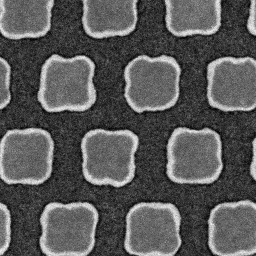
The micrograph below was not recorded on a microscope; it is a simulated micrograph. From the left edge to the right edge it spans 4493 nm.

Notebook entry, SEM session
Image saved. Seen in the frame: raised bodies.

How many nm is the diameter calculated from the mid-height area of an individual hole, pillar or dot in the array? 985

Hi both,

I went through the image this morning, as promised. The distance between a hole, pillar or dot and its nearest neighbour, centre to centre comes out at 1470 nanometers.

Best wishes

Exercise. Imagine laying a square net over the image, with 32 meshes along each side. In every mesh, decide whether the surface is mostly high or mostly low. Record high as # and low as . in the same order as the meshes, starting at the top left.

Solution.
#######....######....######.....
######.....######....######....#
######....#######....######....#
######.....######....######....#
.###............................
................................
................................
......#####......####......#####
#....#######....######....######
#....######.....######....######
#....######.....######....######
#....#######....######....######
#....#######....######....######
......#####......###........####
................................
................................
.#####......##.#......#####.....
######....#######....######.....
######....#######....######.....
######.....######....#######....
######....#######....#######....
######.....######....######.....
.####......#####......####......
................................
................................
.............................###
#.....######....######.....#####
#....#######....######....######
#.....######....######....######
#....#######....######....######
#....#######....######....######
......#####.....######.....#####